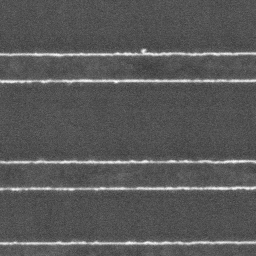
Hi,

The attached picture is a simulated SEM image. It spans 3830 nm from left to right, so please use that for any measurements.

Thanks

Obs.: lines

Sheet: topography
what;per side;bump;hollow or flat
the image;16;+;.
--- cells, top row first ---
................
................
................
++++++++++++++++
++++++++++++++++
................
................
................
................
................
++++++++++++++++
++++++++++++++++
................
................
................
++++++++++++++++